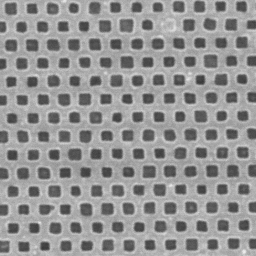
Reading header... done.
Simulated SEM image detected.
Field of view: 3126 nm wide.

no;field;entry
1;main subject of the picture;a regular array of holes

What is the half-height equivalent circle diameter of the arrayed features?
155 nm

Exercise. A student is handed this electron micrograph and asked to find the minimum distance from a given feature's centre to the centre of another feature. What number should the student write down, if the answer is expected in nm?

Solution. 251